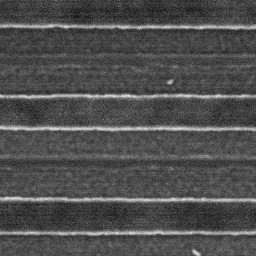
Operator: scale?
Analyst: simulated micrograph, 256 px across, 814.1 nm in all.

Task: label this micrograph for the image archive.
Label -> lines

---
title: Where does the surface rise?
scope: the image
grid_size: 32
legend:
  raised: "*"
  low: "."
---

********************************
********************************
********************************
................................
................................
................................
................................
................................
................................
................................
................................
................................
********************************
********************************
********************************
********************************
................................
................................
................................
................................
................................
................................
................................
................................
................................
********************************
********************************
********************************
********************************
................................
................................
................................